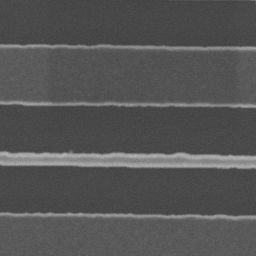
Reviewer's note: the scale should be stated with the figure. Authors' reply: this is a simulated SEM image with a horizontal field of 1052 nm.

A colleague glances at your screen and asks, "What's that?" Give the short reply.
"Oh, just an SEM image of lines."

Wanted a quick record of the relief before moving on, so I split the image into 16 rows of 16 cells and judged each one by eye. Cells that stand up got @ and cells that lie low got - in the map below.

----------------
----------------
----------------
@@@@@@@@@@@@@@@@
@@@@@@@@@@@@@@@@
@@@@@@@@@@@@@@@@
-@@@@@@@@@@@@@@@
----------------
----------------
----------------
----------------
----------------
----------------
@@@@@@@@@@@@@@--
@@@@@@@@@@@@@@@@
@@@@@@@@@@@@@@@@